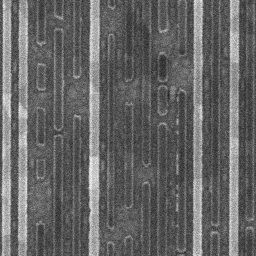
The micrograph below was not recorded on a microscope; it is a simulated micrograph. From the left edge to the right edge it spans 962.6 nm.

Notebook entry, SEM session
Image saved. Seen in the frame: parallel lines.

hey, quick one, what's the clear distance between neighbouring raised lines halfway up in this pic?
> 36.2 nanometres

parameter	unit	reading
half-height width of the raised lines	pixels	7.77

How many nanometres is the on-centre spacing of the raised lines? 65.4